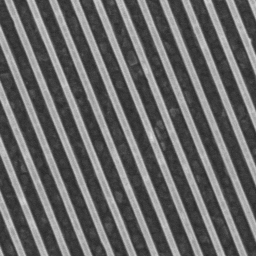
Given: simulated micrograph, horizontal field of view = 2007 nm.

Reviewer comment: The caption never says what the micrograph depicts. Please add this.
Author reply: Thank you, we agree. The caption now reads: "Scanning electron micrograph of parallel lines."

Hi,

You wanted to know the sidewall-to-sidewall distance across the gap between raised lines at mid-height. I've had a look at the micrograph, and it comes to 111 nanometres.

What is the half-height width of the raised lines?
49.1 nanometers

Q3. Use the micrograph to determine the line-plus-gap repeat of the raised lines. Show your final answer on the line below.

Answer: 161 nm